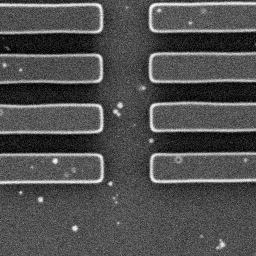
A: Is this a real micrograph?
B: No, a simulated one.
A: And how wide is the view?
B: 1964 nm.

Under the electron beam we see groups of lines, slits or small figures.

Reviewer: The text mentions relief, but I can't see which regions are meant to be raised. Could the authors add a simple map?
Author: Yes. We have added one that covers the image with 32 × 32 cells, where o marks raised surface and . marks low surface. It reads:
........................oooooooo
ooooooooooooo......ooooooooooooo
ooooooooooooo......ooooooooooooo
ooooooooooooo......ooooooooooooo
................................
................................
................................
ooooooooooooo......ooooooooooooo
ooooooooooooo......ooooooooooooo
ooooooooooooo......ooooooooooooo
................................
................................
................................
ooooooooooooo......ooooooooooooo
ooooooooooooo......ooooooooooooo
ooooooooooooo......ooooooooooooo
ooooooooooo.....................
................................
................................
oooooooooooo.......ooooooooooooo
ooooooooooooo......ooooooooooooo
ooooooooooooo......ooooooooooooo
ooooooooooooo......ooooooooooooo
................................
................................
................................
................................
................................
................................
................................
................................
................................